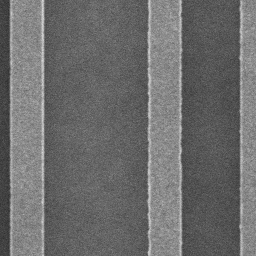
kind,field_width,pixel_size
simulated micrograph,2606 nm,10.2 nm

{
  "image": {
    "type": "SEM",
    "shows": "lines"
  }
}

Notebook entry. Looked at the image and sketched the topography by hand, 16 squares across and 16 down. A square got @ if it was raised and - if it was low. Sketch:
-@@------@@----@
-@@------@@----@
-@@------@@----@
-@@------@@----@
-@@------@@----@
-@@------@@----@
-@@------@@----@
-@@------@@----@
-@@------@@----@
-@@------@@----@
-@@------@@----@
-@@------@@----@
-@@------@@----@
-@@------@@----@
-@@------@@----@
-@@------@@----@